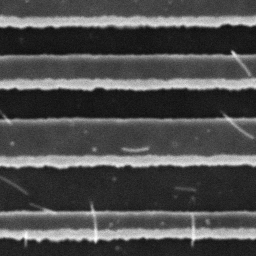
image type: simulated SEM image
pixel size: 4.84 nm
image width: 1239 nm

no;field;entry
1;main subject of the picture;lines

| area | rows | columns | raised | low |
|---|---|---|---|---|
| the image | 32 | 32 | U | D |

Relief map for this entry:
UUUUUUUUUUUUUUUUUUUUUUUUUUUUUUUU
UUUUUUUUUUUUUUUUUUUUUUUUUUUUUUUU
UUUUUUUUUUUUUUUUUUUUUUUUUUUUUUUU
DDDDDDDDDDDDDDDDDDDDDDDDDDDDDDDD
DDDDDDDDDDDDDDDDDDDDDDDDDDDDDDDD
DDDDDDDDDDDDDDDDDDDDDDDDDDDDDDDD
DDDDDDDDDDDDDDDDDDDDDDDDDDDDDDDD
UUUUUUUUUUUUUUUUUUUUUUUUUUUUUUUU
UUUUUUUUUUUUUUUUUUUUUUUUUUUUUUUU
UUUUUUUUUUUUUUUUUUUUUUUUUUUUUUUU
UUUUUUUUUUUUUUUUUUUUUUUUUUUUUUUU
DDDDDDDDDDDDDDDDDDDDDDDDDDDDDDDD
DDDDDDDDDDDDDDDDDDDDDDDDDDDDDDDD
DDDDDDDDDDDDDDDDDDDDDDDDDDDDDDDD
DDDDDDDDDDDDDDDDDDDDDDDDDDDDDDDD
UUUUUUUUUUUUUUUUUUUUUUUUUUUUUUUU
UUUUUUUUUUUUUUUUUUUUUUUUUUUUUUUU
UUUUUUUUUUUUUUUUUUUUUUUUUUUUUUUU
UUUUUUUUUUUUUUUUUUUUUUUUUUUUUUUU
UUUUUUUUUUUUUUUUUUUUUUUUUUUUUUUU
UUUUUUUUUUUUUUUUUUUUUUUUUUUUUUDU
DDDDDDDDDDDDDDDDDDDDDDDDDDDDDDDD
DDDDDDDDDDDDDDDDDDDDDDDDDDDDDDDD
DDDDDDDDDDDDDDDDDDDDDDDDDDDDDDDD
DDDDDDDDDDDDDDDDDDDDDDDDDDDDDDDD
DDDDDDDDDDDDDDDDDDDDDDDDDDDDDDDD
DDUDDDUDDDDUDUDDDDUUUDDDDDDDUUUD
UUUUUUUUUUUUUUUUUUUUUUUUUUUUUUUU
UUUUUUUUUUUUUUUUUUUUUUUUUUUUUUUU
UUUUUUUUUUUUUUUUUUUUUUUUUUUUUUUU
DDDDDDDDDDDDDDDDDDDDDDDDDDDDDDDD
DDDDDDDDDDDDDDDDDDDDDDDDDDDDDDDD